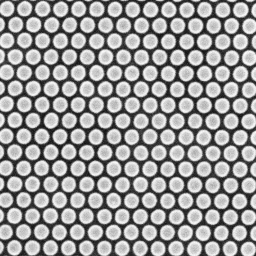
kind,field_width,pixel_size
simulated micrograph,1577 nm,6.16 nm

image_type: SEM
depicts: a regular array of raised bodies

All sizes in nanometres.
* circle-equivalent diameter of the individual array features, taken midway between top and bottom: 84.5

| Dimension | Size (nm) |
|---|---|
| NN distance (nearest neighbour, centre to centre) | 110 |